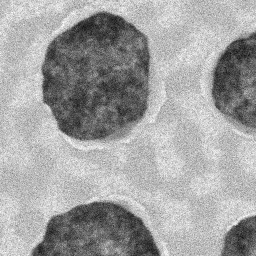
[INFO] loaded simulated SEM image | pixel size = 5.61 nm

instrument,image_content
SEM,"holes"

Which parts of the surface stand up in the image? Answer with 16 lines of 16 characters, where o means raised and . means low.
oooooooooooooooo
ooooo...oooooooo
ooo......oooooo.
ooo......ooooo..
ooo......oooo...
ooo......oooo...
ooo......oooo...
ooo......ooooo..
oooo....oooooooo
oooooooooooooooo
oooooooooooooooo
oooooooooooooooo
oooooooooooooooo
ooo......ooooooo
ooo......ooooo..
oo........oooo..